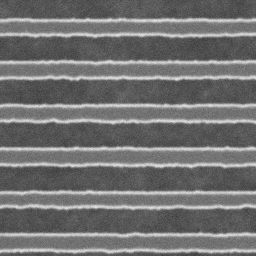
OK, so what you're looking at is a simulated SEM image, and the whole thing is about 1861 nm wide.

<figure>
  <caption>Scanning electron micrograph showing lines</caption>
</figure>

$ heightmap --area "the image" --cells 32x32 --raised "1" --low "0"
00000000000000000000000000000000
00000000000000000000000000000000
11111111111111111111111111111111
11111111111111111111111111111111
00000000000000000000000000000000
00000000000000000000000000000000
00000000000000000000000000000000
00000000000000000000000000000000
11111111111111111111111111111111
11111111111111111111111111111111
00000000000000000000000000000000
00000000000000000000000000000000
00000000000000000000000000000000
11111111111111111111111111111111
11111111111111111111111111111111
00000000000000000000000000000000
00000000000000000000000000000000
00000000000000000000000000000000
00000000000000000000000000000000
11111111111111111111111111111111
11111111111111111111111111111111
00000000000000000000000000000000
00000000000000000000000000000000
00000000000000000000000000000000
11111111111111111111111111111111
11111111111111111111111111111111
00000000000000000000000000000000
00000000000000000000000000000000
00000000000000000000000000000000
11111111111111111111111111111111
11111111111111111111111111111111
00000000000000000000000000000000